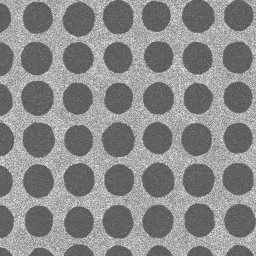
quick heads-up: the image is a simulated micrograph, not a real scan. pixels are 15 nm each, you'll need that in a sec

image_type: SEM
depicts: a regular array of holes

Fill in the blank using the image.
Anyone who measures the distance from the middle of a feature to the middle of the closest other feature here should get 595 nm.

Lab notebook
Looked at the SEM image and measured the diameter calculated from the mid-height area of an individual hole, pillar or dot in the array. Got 0.474 µm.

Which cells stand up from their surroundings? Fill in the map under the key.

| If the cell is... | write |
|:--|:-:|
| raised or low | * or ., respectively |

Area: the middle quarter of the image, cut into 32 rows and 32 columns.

.......****......****......***..
*.....******....******....*****.
***.****************************
********************************
***********************.********
*.....******....*****.....*****.
.......****......***.......***..
.......***.......***.......***..
.......***.......***........**..
.......***.......***........**..
.......***.......***.......***..
*.....*****.....*****......****.
**..*********.********...*******
********************************
*************.******************
**...******.....*****.....*****.
*.....****.......***.......***..
.......***.......***.......***..
.......**.........**.......**...
.......***........**.......**...
.......***.......***.......***..
*.....****.......****.....****..
**....*****.....*******..******.
********************************
********************************
*.....******....*****.....*****.
*......****......***.......***..
.......***.......***.......***..
........**........*.........**..
........**........**........**..
........**.......***........**..
*......****......***.......***..